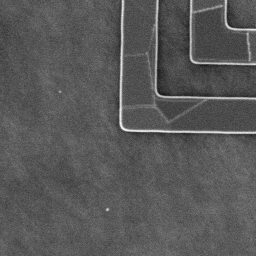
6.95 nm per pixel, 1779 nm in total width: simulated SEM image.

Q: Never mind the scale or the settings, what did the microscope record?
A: groups of lines, slits or small figures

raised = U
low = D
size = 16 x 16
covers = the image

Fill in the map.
DDDDDDDDUUDDUUDD
DDDDDDDDUUDDUUDD
DDDDDDDDUUDDUUUU
DDDDDDDDUUDDUUUU
DDDDDDDDUUDDDDDD
DDDDDDDDUUDDDDDD
DDDDDDDDUUUUUUUU
DDDDDDDDUUUUUUUU
DDDDDDDDDDDDDDDD
DDDDDDDDDDDDDDDD
DDDDDDDDDDDDDDDD
DDDDDDDDDDDDDDDD
DDDDDDDDDDDDDDDD
DDDDDDDDDDDDDDDD
DDDDDDDDDDDDDDDD
DDDDDDDDDDDDDDDD